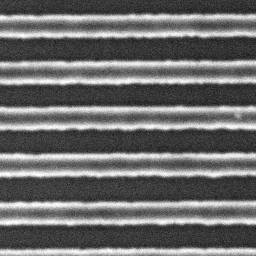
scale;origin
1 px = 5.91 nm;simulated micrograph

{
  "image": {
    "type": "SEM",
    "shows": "lines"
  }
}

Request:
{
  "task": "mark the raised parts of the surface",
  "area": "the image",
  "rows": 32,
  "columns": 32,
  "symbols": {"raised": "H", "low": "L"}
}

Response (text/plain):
LLLLLLLLLLLLLLLLLLLLLLLLLLLLLLLL
LLLLLLLLLLLLLLLLLLLLLLLLLLLLLLLL
HHHHHHHHHHHHHHHHHHHHHHHHHHHHHHHH
HHHHHHHHHHHHHHHHHHHHHHHHHHHHHHHH
LHHHHHHHHHHHHHHHLHHLHLLLLHLLLLLL
LLLLLLLLLLLLLLLLLLLLLLLLLLLLLLLL
LLLLLLLLLLLLLLLLLLLLLLLLLLLLLLLL
LLLLLLLLLLLLLLLLLLLLLLLLLLLLLLLL
HHHHHHHHHHHHHHHHHHHHHHHHHHHHHHHH
HHHHHHHHHHHHHHHHHHHHHHHHHHHHHHHH
LLLLLLLLLLLLLLLLLLLLLLLLLLLLLLLL
LLLLLLLLLLLLLLLLLLLLLLLLLLLLLLLL
LLLLLLLLLLLLLLLLLLLLLLLLLLLLLLLL
LLLLLLLLLLLLLLLLLLLLLLHLLLLHLHLH
HHHHHHHHHHHHHHHHHHHHHHHHHHHHHHHH
HHHHHHHHHHHHHHHHHHHHHHHHHHHHHHHH
LLLLLLLLLLLLLLLLLLLLLLLLLLLLLLLL
LLLLLLLLLLLLLLLLLLLLLLLLLLLLLLLL
LLLLLLLLLLLLLLLLLLLLLLLLLLLLLLLL
HHHHLHHHHHHHHHHHHHHHHHHHHHHHHHHH
HHHHHHHHHHHHHHHHHHHHHHHHHHHHHHHH
HHHHHHHHHHHHHHHHHHHHHHHHHHHHHHHH
LLLLLLLLLLLLLLLLLLLLLLLLLLLLLLLL
LLLLLLLLLLLLLLLLLLLLLLLLLLLLLLLL
LLLLLLLLLLLLLLLLLLLLLLLLLLLLLLLL
LLHLHHHHHHHLHHHHHHHHHHHHHHHHHHHH
HHHHHHHHHHHHHHHHHHHHHHHHHHHHHHHH
HHHHHHHHHHHHHHHHHHHHHHHHHHHHHHHH
LLLLLLLLLLLLLLLLLLLLLLLLLLLLLLLL
LLLLLLLLLLLLLLLLLLLLLLLLLLLLLLLL
LLLLLLLLLLLLLLLLLLLLLLLLLLLLLLLL
HHHHHHHHHHHHHHHHHHHHHHHHHHHHHHHH